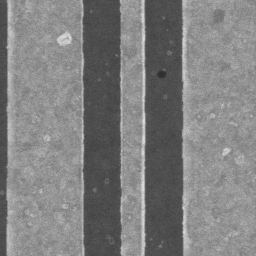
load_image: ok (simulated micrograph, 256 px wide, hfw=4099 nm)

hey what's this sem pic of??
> lines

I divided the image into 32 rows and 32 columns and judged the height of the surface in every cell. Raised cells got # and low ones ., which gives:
.#########.....###.....#########
.#########.....###.....#########
.#########.....###.....#########
.#########.....###.....#########
.#########.....###.....#########
.#########.....###.....#########
.#########.....###.....#########
.#########.....###.....#########
.#########.....###.....#########
.#########.....###.....#########
.#########.....###.....#########
.#########.....###.....#########
.#########.....###.....#########
.#########.....###.....#########
.#########.....###.....#########
.#########.....###.....#########
.#########.....###.....#########
.#########.....###.....#########
.#########.....###.....#########
.#########.....###.....#########
..########.....###.....#########
..########.....###.....#########
..########.....###.....#########
..########.....###.....#########
.#########.....###.....#########
.#########.....###.....#########
.#########.....###.....#########
.#########.....###.....#########
.#########.....###.....#########
.#########.....###.....#########
.#########.....###.....#########
.#########.....###.....#########